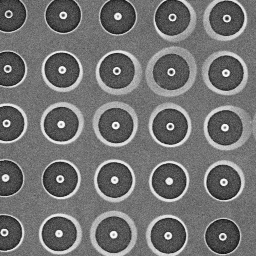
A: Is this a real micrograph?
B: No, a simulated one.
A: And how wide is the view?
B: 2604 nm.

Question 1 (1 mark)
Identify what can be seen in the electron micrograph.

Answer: an array of small figures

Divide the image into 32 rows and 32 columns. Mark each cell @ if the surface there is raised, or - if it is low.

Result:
---@@@----@@@---@@@@---@@@@---@@
---@@@----@@@----@@-----@@-----@
---@@@----@@@----@@-----@@--@--@
--@@@@----@@@---@@@@----@@----@@
@@@@@@@@@@@@@@@@@@@@@--@@@@--@@@
@@@@@@@@@@@@@@@@@@@@@@@@@@@@@@@@
--@@@@@-@@@@@@-@@@@@---@@@@@@@@@
---@@@----@@@----@@-----@@----@@
---@@-----@@-----@@-----@@-----@
---@@@----@@-----@@-----@@-----@
--@@@@----@@@----@@-----@@----@@
@@@@@@@@@@@@@@-@@@@@--@@@@@@-@@@
@@@@@@@@@@@@@@@@@@@@@@@@@@@@@@@@
--@@@@---@@@@---@@@@--@@@@@@-@@@
---@@@----@@-----@@----@@@----@@
---@@-----@@-----@@-----@@-----@
---@@-----@@-----@@-----@@-----@
--@@@@---@@@@---@@@@---@@@----@@
@@@@@@@@@@@@@@@@@@@@@@@@@@@@@@@@
@@@@@@@@@@@@@@@@@@@@@@@@@@@@@@@@
--@@@@---@@@@---@@@@--@@@@@--@@@
---@@@----@@----@@@----@@@----@@
---@@-----@@-----@@----@@@----@@
---@@@----@@-----@@----@@@----@@
-@@@@@@--@@@@---@@@@---@@@----@@
@@@@@@@@@@@@@@@@@@@@@@@@@@@@@@@@
@@@@@@@@@@@@@@@@@@@@@@@@@@@@@@@@
--@@@@---@@@----@@@@--@@@@@--@@@
---@@-----@@-----@@----@@@----@@
---@@-----@@-----@-----@@@----@@
--@@@----@@@-----@@----@@@----@@
@@@@@@@-@@@@@---@@@@--@@@@@--@@@